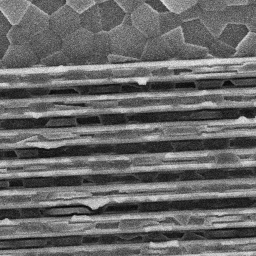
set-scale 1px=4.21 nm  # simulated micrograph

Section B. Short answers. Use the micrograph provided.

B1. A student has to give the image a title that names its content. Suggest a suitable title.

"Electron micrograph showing parallel lines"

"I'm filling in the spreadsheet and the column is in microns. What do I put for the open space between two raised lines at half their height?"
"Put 0.0583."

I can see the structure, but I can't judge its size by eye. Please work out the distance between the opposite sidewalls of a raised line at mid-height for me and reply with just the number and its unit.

0.0693 um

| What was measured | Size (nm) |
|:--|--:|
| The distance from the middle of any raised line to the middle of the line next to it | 126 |